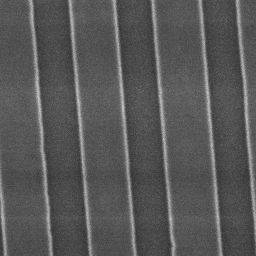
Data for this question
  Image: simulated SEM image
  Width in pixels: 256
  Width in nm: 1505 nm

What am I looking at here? one or a few lines or trenches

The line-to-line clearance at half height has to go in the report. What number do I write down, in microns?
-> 0.22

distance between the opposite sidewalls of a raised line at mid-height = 46.7 pixels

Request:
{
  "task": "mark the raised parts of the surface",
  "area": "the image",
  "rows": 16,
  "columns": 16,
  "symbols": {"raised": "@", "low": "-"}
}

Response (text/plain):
@@--@@@---@@@--@
@@--@@@---@@@--@
@@---@@---@@@--@
@@---@@---@@@--@
@@---@@@--@@@--@
@@---@@@--@@@--@
@@---@@@--@@@--@
@@@--@@@--@@@--@
@@@--@@@--@@@--@
@@@--@@@--@@@---
@@@--@@@--@@@---
@@@--@@@--@@@@--
@@@--@@@---@@@--
@@@--@@@---@@@--
@@@---@@---@@@--
@@@---@@---@@@--